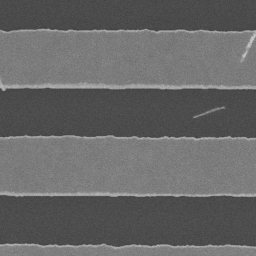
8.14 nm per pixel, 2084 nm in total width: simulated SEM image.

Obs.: lines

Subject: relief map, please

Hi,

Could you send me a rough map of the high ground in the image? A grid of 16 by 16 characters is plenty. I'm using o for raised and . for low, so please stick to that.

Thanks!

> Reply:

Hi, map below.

................
................
oooooooooooooooo
oooooooooooooooo
oooooooooooooooo
o.....oo..oo.ooo
................
................
.o..o.o.........
oooooooooooooooo
oooooooooooooooo
oooooooooooooooo
................
................
................
oooooooooooooooo